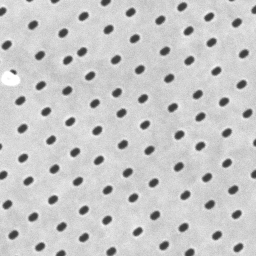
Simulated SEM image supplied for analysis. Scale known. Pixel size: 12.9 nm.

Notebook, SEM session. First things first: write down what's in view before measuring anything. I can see a regular array of holes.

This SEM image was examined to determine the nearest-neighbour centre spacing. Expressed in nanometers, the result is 333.